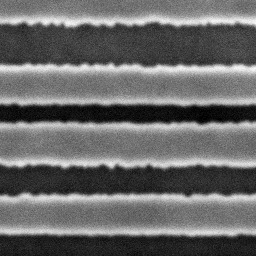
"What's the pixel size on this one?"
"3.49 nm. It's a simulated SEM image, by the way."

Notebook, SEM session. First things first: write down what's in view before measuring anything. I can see lines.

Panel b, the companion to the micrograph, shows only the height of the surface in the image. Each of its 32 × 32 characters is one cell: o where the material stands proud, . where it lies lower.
oooooooooooooooooooooooooooooooo
oooooooooooooooooooooooooooooooo
oooooooooooooooooooooooooooooooo
................................
................................
................................
................................
................................
oooooooooooooooooo.ooooooooooooo
oooooooooooooooooooooooooooooooo
oooooooooooooooooooooooooooooooo
oooooooooooooooooooooooooooooooo
oooooooooooooooooooooooooooooooo
................................
................................
o.o.oooooo....oo...o.oooo.ooo.oo
oooooooooooooooooooooooooooooooo
oooooooooooooooooooooooooooooooo
oooooooooooooooooooooooooooooooo
oooooooooooooooooooooooooooooooo
ooo.o.oooooooooooooooooo.ooooooo
................................
................................
................................
..oo.ooooo.oooooooooooo.o.oo.ooo
oooooooooooooooooooooooooooooooo
oooooooooooooooooooooooooooooooo
oooooooooooooooooooooooooooooooo
oooooooooooooooooooooooooooooooo
................................
................................
................................